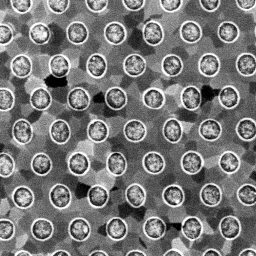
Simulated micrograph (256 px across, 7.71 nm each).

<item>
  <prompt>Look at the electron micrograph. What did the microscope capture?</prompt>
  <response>a regular array of holes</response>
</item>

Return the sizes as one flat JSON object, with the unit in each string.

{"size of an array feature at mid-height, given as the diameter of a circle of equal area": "0.163 microns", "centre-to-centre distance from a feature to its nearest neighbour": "286 nm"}